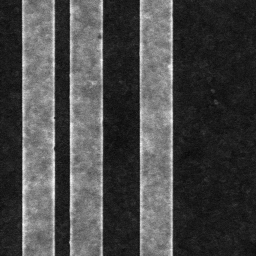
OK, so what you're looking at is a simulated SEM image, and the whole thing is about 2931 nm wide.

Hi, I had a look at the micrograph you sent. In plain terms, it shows parallel lines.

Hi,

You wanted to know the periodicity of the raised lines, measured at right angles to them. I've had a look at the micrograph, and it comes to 676 nm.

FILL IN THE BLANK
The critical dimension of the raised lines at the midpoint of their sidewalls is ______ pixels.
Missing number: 32.1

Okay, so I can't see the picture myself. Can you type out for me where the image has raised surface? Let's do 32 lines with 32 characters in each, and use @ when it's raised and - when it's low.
---@@@@--@@@@-----@@@-----------
---@@@@--@@@@-----@@@-----------
---@@@@--@@@@-----@@@-----------
---@@@@--@@@@-----@@@-----------
---@@@@--@@@@-----@@@-----------
---@@@@--@@@@-----@@@-----------
---@@@@--@@@@-----@@@-----------
---@@@@--@@@@-----@@@-----------
---@@@@--@@@@-----@@@-----------
---@@@@--@@@@-----@@@-----------
---@@@@--@@@@-----@@@-----------
---@@@@--@@@@-----@@@-----------
---@@@@--@@@@-----@@@-----------
---@@@@--@@@@-----@@@-----------
---@@@@--@@@@-----@@@-----------
---@@@@--@@@@-----@@@-----------
---@@@@--@@@@-----@@@-----------
---@@@@--@@@@-----@@@-----------
---@@@@--@@@@-----@@@-----------
---@@@@--@@@@-----@@@-----------
---@@@@--@@@@-----@@@@----------
---@@@@--@@@@-----@@@@----------
---@@@@--@@@@-----@@@@----------
---@@@@--@@@@-----@@@@----------
---@@@@--@@@@-----@@@@----------
---@@@@--@@@@-----@@@@----------
---@@@@--@@@@-----@@@@----------
---@@@@--@@@@-----@@@@----------
---@@@@--@@@@-----@@@@----------
---@@@@--@@@@-----@@@@----------
---@@@@--@@@@-----@@@@----------
---@@@@--@@@@-----@@@@----------